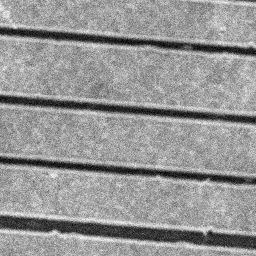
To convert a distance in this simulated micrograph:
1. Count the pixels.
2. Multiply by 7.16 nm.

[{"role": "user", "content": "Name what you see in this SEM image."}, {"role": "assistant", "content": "one or a few lines or trenches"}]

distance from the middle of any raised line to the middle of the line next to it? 443 nanometres